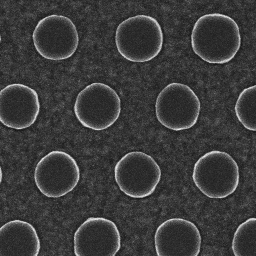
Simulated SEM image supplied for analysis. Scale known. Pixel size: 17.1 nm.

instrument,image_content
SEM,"a regular array of raised bodies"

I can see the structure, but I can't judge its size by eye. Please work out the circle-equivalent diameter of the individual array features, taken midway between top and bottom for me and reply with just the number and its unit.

774 nm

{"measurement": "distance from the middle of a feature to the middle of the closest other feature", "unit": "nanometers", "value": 1340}